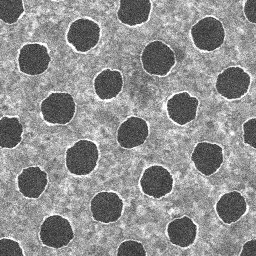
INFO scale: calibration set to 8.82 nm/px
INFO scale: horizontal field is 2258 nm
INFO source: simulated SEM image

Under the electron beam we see a regular array of holes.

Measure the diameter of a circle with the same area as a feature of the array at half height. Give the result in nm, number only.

290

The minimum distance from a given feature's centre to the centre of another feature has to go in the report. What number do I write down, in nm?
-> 484